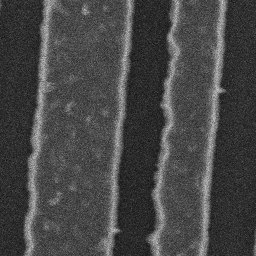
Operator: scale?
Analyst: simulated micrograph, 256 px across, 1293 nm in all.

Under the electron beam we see one or a few lines or trenches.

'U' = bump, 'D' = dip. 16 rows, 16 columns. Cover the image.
DDDUUUUUDDDUUUDD
DDDUUUUUDDDUUUDD
DDDUUUUUDDDUUUDD
DDDUUUUUDDDUUUDD
DDDUUUUUDDDUUUDD
DDUUUUUUDDUUUUDD
DDUUUUUUDDUUUUDD
DDUUUUUUDDUUUDDD
DDUUUUUUDDUUUDDD
DDUUUUUDDDUUUDDD
DDUUUUUDDDUUUDDD
DDUUUUUDDDUUUDDD
DDUUUUUDDDUUUDDD
DDUUUUUDDDUUUDDD
DDUUUUUDDDUUUDDD
DDUUUUUDDDUUUDDD